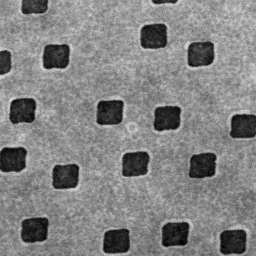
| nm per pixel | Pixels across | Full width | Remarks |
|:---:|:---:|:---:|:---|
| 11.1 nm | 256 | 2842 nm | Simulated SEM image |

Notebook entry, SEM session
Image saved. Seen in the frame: a regular array of holes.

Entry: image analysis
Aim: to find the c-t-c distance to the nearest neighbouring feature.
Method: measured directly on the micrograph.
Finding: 646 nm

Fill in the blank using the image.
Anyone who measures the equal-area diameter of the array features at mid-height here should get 28.9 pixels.